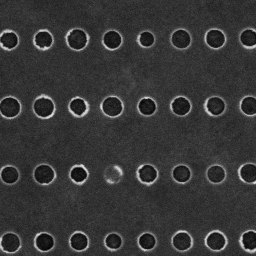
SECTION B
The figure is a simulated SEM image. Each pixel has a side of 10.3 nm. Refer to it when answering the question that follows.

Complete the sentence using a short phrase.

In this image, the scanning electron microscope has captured a regular array of holes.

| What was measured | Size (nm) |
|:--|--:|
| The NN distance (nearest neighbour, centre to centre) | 352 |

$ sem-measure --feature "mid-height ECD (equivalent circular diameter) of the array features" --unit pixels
17.7